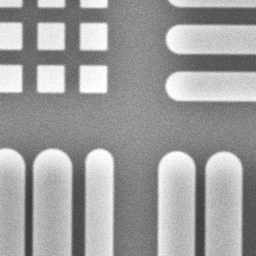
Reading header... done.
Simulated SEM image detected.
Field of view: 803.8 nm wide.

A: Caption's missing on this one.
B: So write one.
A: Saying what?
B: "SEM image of groups of lines, slits or small figures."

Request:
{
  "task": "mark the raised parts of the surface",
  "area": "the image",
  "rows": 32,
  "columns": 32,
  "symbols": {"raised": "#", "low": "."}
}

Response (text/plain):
###..###..###.........##########
................................
................................
###..###..###.........##########
###..###..###........###########
###..###..###........###########
......................##########
................................
###..###..###...................
###..###..###........###########
###..###..###........###########
..........###........###########
......................##########
................................
................................
................................
................................
................................
................................
###..###...###.......##....##...
###.#####..###......####..####..
###.#####..###......####..####..
###.#####..###......####..####..
###.#####..###......####..####..
###.#####..###......####..####..
###.#####..###......####..####..
###.#####..###......####..####..
###.#####..###......####..####..
###.#####..###......####..####..
###.#####..###......####..####..
###.#####..###......####..####..
###.#####..###......####..####..